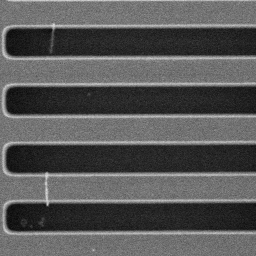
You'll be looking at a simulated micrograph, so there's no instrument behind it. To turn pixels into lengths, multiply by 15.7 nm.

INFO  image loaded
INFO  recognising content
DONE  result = groups of lines, slits or small figures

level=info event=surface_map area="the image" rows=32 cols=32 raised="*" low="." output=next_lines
********************************
********************************
********************************
*...............................
*...............................
................................
*...............................
********************************
********************************
********************************
********************************
*...............................
................................
*...............................
**.......***********************
********************************
********************************
********************************
*...............................
*...............................
*...............................
*...............................
********************************
********************************
********************************
*...............................
*...............................
*...............................
*...............................
********************************
********************************
********************************